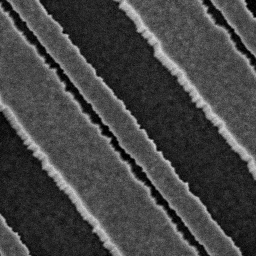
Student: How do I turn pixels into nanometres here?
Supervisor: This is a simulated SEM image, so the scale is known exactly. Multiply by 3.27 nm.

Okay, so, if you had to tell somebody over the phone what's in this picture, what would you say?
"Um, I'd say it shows lines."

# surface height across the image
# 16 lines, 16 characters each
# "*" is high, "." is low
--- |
***.....********
****.....*******
****......******
*****.....******
******.....*****
*******.....****
********.....***
.*******.....***
..*******.....**
..********.....*
...********.....
....********....
.....*******....
......*******...
*.....********..
**.....********.